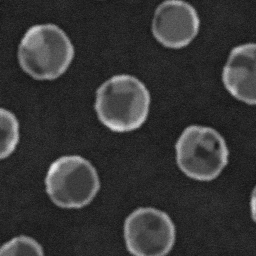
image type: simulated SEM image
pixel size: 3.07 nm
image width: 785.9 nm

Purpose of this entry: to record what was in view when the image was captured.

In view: raised bodies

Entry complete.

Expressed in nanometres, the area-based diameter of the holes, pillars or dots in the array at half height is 153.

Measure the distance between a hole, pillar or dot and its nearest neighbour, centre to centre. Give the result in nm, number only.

286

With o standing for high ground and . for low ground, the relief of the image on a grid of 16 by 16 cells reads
..........oo....
..........oo....
..oo......oo....
.ooo...........o
..oo..........oo
......ooo.....oo
......ooo.......
o.....ooo.......
o..........ooo..
...........ooo..
...ooo.....ooo..
...ooo..........
...ooo..........
........oo......
........ooo.....
oo......oo......